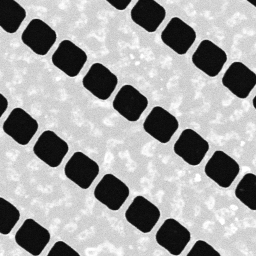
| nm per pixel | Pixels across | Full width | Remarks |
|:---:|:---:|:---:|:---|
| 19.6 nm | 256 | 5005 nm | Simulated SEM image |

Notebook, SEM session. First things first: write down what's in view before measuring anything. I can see a regular array of holes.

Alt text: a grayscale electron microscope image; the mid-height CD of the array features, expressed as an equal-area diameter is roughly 653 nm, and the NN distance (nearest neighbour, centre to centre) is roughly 732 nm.